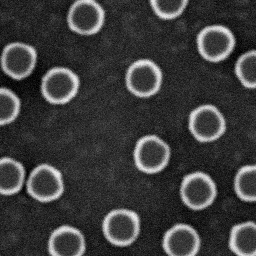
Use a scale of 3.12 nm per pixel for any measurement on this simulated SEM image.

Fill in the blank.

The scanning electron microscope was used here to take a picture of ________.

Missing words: a regular array of raised bodies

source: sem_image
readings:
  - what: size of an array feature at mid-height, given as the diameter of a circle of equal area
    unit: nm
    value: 106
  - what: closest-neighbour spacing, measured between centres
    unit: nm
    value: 196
